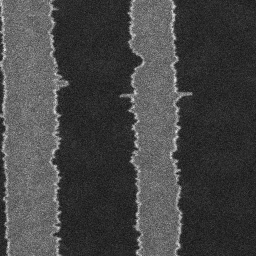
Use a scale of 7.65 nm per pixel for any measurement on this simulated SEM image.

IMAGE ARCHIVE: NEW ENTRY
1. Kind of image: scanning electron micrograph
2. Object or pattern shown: one or a few lines or trenches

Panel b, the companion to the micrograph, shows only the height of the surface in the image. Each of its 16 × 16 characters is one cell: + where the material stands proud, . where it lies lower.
+++.....+++.....
+++.....+++.....
+++.....+++.....
+++......++.....
++++....+++.....
++++....+++.....
+++.....+++.....
++++....+++.....
++++....+++.....
+++.....+++.....
+++.....+++.....
++++.....++.....
++++.....++.....
++++.....++.....
++++.....++.....
.+++.....++.....